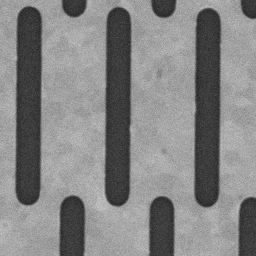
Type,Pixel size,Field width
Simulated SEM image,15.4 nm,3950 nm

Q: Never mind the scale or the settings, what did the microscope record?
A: groups of lines, slits or small figures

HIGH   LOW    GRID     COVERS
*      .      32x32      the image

********...********...********..
**...***...***..***...***..***..
**...********...*********...****
**...********....*******....****
**...********....*******....****
**...********....*******....****
**...********....*******....****
**...********....*******....****
**...********....*******....****
**...********....*******....****
**...********...********....****
**...********...********....****
**...********...********....****
**...********...********....****
**...********...********....****
**...********...********....****
**...********...********....****
**...********...********....****
**...********...********....****
**...********...********....****
**...********...********....****
**...********...********....****
**...********...********....****
**...********...********....****
**...****.***...****.***...*****
***.****...***..***...***..***..
*******....********...********..
*******....********...********..
*******....********...********..
*******....********...********..
*******....********...********..
*******....********...********..